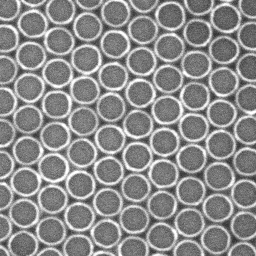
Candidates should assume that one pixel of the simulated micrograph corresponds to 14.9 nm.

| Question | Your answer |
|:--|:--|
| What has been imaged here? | a regular array of holes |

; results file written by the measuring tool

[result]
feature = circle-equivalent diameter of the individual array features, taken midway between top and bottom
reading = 382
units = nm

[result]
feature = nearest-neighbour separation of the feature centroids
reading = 465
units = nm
